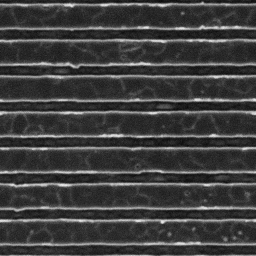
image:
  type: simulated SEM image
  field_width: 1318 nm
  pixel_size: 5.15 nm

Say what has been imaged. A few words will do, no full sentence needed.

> parallel lines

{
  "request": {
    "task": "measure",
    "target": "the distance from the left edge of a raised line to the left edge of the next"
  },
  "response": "186 nm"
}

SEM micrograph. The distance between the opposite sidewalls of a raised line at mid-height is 129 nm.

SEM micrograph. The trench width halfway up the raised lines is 10.6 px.